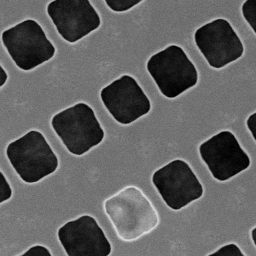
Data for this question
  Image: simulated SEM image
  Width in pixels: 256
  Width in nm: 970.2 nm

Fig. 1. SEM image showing a regular array of holes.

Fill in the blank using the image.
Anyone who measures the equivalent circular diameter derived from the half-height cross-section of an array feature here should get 175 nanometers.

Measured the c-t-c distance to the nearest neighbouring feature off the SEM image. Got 206 nm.